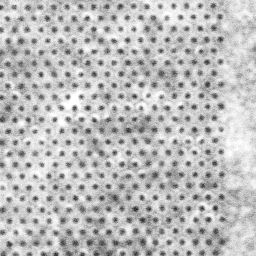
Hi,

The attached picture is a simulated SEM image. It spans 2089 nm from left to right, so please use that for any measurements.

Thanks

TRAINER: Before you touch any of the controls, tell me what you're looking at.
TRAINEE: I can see a regular array of holes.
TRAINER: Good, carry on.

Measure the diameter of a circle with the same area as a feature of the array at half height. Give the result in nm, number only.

63.1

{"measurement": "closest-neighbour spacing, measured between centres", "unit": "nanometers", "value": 103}